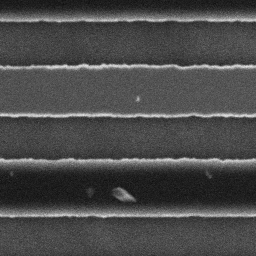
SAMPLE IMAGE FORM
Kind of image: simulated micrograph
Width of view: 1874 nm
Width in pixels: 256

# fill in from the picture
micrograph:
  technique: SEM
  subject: lines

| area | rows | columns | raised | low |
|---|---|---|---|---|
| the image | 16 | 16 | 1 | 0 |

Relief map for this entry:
1111111111111111
0000000000000000
0000000000000000
0000000000000000
1111111111111111
1111111111111111
1111111111111111
0000000000000000
0000000000000000
0000000000000000
1111111111111111
1111111111111111
1111111111111111
1000001000000000
0000000000000000
0000000000000000